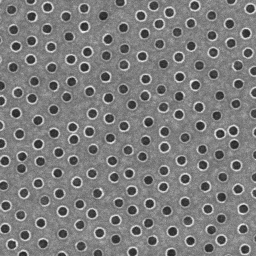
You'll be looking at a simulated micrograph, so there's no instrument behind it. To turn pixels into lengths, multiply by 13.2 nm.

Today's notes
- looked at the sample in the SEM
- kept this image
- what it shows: a regular array of holes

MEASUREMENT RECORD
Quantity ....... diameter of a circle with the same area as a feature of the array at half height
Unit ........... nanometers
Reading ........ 124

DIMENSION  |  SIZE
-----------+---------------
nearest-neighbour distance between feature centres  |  229 nm